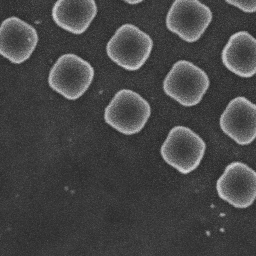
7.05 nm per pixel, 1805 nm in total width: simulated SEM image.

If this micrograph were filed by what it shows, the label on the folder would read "raised bodies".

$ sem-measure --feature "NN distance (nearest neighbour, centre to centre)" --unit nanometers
459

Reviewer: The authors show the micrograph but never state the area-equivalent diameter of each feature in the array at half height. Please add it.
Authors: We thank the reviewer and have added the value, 292 nanometers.